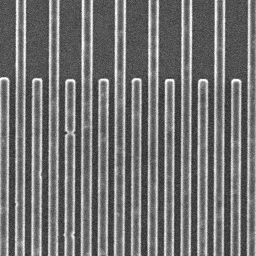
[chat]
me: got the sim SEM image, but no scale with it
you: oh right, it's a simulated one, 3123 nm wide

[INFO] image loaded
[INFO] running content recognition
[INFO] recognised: parallel lines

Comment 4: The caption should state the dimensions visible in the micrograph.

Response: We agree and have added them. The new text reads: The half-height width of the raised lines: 113 nanometres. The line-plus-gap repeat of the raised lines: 202 nanometers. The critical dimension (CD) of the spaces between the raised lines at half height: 93 nanometers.